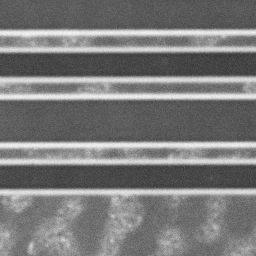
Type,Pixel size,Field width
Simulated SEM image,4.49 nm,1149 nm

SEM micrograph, parallel lines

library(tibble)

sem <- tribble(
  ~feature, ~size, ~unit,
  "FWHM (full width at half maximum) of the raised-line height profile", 18.1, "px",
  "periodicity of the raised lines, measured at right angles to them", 252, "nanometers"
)